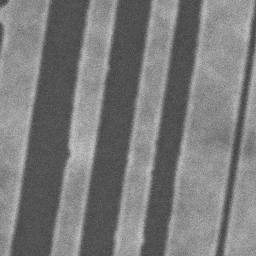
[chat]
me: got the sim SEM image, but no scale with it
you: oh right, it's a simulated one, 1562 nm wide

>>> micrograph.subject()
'one or a few lines or trenches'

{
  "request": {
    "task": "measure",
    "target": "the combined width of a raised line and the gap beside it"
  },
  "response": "384 nm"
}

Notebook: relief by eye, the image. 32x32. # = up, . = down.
.#####.....###.....###....######
######.....###.....###....#####.
######.....###.....###...######.
.####......###.....##....######.
.####......###.....##....######.
.####......###.....##....######.
#####.....###.....###....######.
#####.....###.....###....#####..
#####.....###.....###....#####..
#####.....###.....###...######..
####......###.....##....######..
####......###.....##....######.#
####......##.....###....######.#
####.....###.....###....######.#
####.....###.....###....#####..#
####.....###.....###...######..#
###......###.....##....######..#
###......###.....##....######.##
###......###.....##....######.##
###......##.....###....######.##
###......##.....###....#####..##
###.....###.....###...######..##
##......###.....###...######..##
##......###.....##....######..##
##......###....###....######.###
##......##.....###....######.###
##......##.....###....######.###
##.....###.....###....#####..###
##.....###.....###...######..###
#......###.....###...######..###
#......###.....##....######.####
#......###....###....######.####